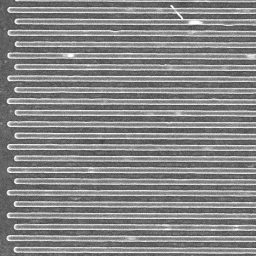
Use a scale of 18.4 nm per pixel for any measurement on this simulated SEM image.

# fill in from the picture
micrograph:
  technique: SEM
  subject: parallel lines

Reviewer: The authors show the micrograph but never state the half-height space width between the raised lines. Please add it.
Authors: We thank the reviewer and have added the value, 115 nm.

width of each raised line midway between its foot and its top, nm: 92.3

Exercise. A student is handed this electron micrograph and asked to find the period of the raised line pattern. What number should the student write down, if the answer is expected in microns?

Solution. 0.211